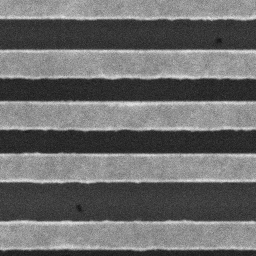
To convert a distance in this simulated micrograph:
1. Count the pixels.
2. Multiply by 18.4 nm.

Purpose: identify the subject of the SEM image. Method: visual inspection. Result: lines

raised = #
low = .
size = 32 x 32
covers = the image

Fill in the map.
################################
################################
................................
................................
................................
................................
################################
################################
################################
################################
................................
................................
................................
################################
################################
################################
................................
................................
................................
################################
################################
################################
################################
................................
................................
................................
................................
................................
################################
################################
################################
................................